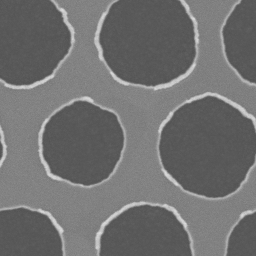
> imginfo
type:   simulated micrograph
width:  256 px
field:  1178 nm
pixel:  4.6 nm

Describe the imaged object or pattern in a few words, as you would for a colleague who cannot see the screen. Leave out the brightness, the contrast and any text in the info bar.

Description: holes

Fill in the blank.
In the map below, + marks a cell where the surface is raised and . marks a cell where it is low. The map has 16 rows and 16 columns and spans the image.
....+++.....+++.
....++......++..
....++......++..
....++......++..
...++++.....+++.
++++++++++++++++
++++..++++++..++
+++....++++.....
+++.....++......
+++.....++......
+++....+++......
+++++.+++++....+
++++++++++++++++
...++++....++++.
....++......++..
....++......++..